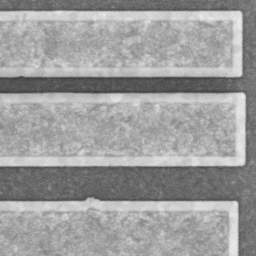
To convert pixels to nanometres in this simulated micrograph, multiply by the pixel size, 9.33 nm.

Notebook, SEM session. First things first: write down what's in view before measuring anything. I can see one or a few lines or trenches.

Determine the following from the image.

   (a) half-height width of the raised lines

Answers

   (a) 574 nanometres